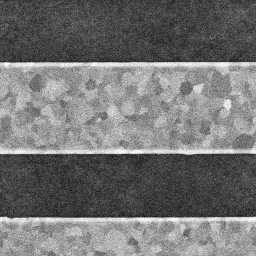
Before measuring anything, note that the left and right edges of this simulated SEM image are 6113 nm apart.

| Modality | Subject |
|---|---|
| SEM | one or a few lines or trenches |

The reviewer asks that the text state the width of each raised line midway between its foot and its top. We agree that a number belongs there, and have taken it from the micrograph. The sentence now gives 2070 nm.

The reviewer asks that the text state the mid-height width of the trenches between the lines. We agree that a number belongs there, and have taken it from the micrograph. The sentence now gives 1620 nm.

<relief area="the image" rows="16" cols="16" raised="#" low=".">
................
................
................
................
################
################
################
################
################
................
................
................
................
................
################
################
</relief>